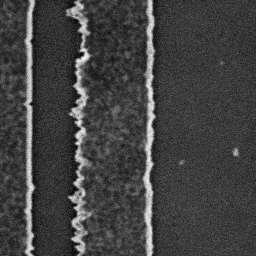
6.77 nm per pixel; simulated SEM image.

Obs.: one or a few lines or trenches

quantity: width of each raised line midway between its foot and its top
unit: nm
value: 477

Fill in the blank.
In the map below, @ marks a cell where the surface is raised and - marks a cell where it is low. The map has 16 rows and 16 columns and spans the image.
@@---@@@@-------
@@---@@@@-------
@@---@@@@-------
@@---@@@@-------
@@---@@@@-------
@@---@@@@-------
@@---@@@@-------
@@---@@@@-------
@@---@@@@-------
@@---@@@@-------
@@---@@@@-------
@@---@@@@-------
@@---@@@@-------
@@---@@@@-------
@@---@@@@-------
@@---@@@@-------